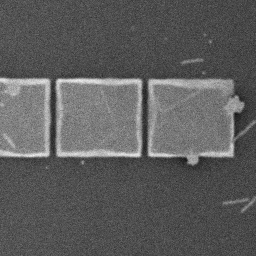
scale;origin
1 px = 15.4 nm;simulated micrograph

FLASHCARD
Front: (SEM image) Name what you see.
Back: wiring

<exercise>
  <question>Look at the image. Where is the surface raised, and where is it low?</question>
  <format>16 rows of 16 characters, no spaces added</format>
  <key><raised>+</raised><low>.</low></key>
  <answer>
................
................
................
................
................
+++.++++++++++..
+++.+++++++++++.
+++.+++++.+++++.
+++.+++++++++++.
+++.+++++.++++..
................
................
................
................
................
................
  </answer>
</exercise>